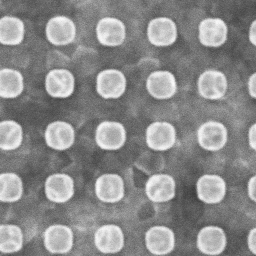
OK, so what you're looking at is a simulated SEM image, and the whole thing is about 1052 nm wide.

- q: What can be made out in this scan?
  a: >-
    a regular array of raised bodies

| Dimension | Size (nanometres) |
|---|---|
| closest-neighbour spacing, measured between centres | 208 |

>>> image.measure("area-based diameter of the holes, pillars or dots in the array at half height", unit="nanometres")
114